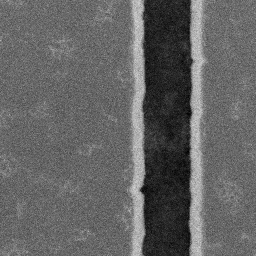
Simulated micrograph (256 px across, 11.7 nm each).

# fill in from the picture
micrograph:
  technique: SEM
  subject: one or a few lines or trenches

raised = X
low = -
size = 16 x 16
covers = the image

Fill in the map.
XXXXXXXXX---XXXX
XXXXXXXXX---XXXX
XXXXXXXXX---XXXX
XXXXXXXXX---XXXX
XXXXXXXXX---XXXX
XXXXXXXXX---XXXX
XXXXXXXXX---XXXX
XXXXXXXXX---XXXX
XXXXXXXXX---XXXX
XXXXXXXXX---XXXX
XXXXXXXXX---XXXX
XXXXXXXXX---XXXX
XXXXXXXXX---XXXX
XXXXXXXXX---XXXX
XXXXXXXXX---XXXX
XXXXXXXXX---XXXX